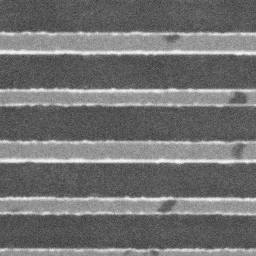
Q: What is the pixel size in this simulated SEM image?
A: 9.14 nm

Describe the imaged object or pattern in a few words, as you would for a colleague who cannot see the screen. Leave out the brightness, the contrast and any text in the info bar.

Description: lines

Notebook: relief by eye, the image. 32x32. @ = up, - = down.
--------------------------------
--------------------------------
--------------------------------
--------------------------------
@@@@@@@@@@@@@@@@@@@@@@@@@@@@@@@@
@@@@@@@@@@@@@@@@@@@@@@@@@@@@@@@@
@@@@@@@@@@@@@@@@@@@@@@@@@@@@@@@@
--------------------------------
--------------------------------
--------------------------------
--------------------------------
@@@@@@@@@@@@@@@@@@@@@@@@@@@@@@@@
@@@@@@@@@@@@@@@@@@@@@@@@@@@@@@@@
--------------------------------
--------------------------------
--------------------------------
--------------------------------
--------------------------------
@@@@@@@@@@@@@@@@@@@@@@@@@@@@@@@@
@@@@@@@@@@@@@@@@@@@@@@@@@@@@@@@@
--------------------------------
--------------------------------
--------------------------------
--------------------------------
--------------------------------
@@@@@@@@@@@@@@@@@@@@@@@@@@@@@@@@
@@@@@@@@@@@@@@@@@@@@@@@@@@@@@@@@
--------------------------------
--------------------------------
--------------------------------
--------------------------------
@@@@@@@@@@@@@@@@@@@@@@@@@@@@@@@@